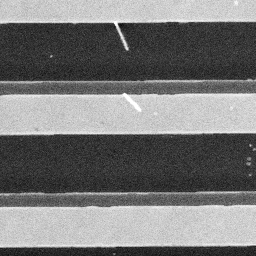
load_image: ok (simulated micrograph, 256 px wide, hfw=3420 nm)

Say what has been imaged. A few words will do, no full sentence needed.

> lines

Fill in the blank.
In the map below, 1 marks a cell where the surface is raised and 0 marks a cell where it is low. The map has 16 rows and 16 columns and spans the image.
1111111111111111
0000000000000000
0000000000000000
0000000000000000
0000000000000000
1111111111111111
1111111111111111
1111111111111111
0000000000000000
0000000000000000
0000000000000000
0000000000000000
1111111111111111
1111111111111111
1111111111111111
0000000000000000